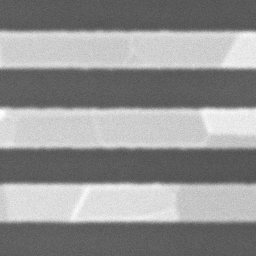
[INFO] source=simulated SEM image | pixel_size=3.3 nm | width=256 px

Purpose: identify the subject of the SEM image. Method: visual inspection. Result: lines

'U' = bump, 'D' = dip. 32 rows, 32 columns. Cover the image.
DDDDDDDDDDDDDDDDDDDDDDDDDDDDDDDD
DDDDDDDDDDDDDDDDDDDDDDDDDDDDDDDD
DDDDDDDDDDDDDDDDDDDDDDDDDDDDDDDD
DDDDDDDDDDDDDDDDDDDDDDDDDDDDDDDD
UUUUUUUUUUUUUUUUUUUUUUUUUUUUUUUU
UUUUUUUUUUUUUUUUUUUUUUUUUUUUUUUU
UUUUUUUUUUUUUUUUUUUUUUUUUUUUUUUU
UUUUUUUUUUUUUUUUUUUUUUUUUUUUUUUU
DDDDDDDDDDUDDDDDDDDDDDDDDDDDDDDD
DDDDDDDDDDDDDDDDDDDDDDDDDDDDDDDD
DDDDDDDDDDDDDDDDDDDDDDDDDDDDDDDD
DDDDDDDDDDDDDDDDDDDDDDDDDDDDDDDD
DDDDDDDDDDDDDDDDDDDDDDDDDDDDDDDD
DDDDDDDDDDDDDDDDDDDDDDDDDDDDDDDD
UUUUUUUUUUUUUUUUUUUUUUUUUUUUUUUU
UUUUUUUUUUUUUUUUUUUUUUUUUUUUUUUU
UUUUUUUUUUUUUUUUUUUUUUUUUUUUUUUU
UUUUUUUUUUUUUUUUUUUUUUUUUUUUUUUU
DDDDDDDDDDDDDDDDDDDDDDDDDDDDDDDD
DDDDDDDDDDDDDDDDDDDDDDDDDDDDDDDD
DDDDDDDDDDDDDDDDDDDDDDDDDDDDDDDD
DDDDDDDDDDDDDDDDDDDDDDDDDDDDDDDD
DDDDDDDDDDDDDDDDDDDDDDDDDDDDDDDD
UUUUUUUUUUUUUUUUUUUUUUUUUUUUUUUU
UUUUUUUUUUUUUUUUUUUUUUUUUUUUUUUU
UUUUUUUUUUUUUUUUUUUUUUUUUUUUUUUU
UUUUUUUUUUUUUUUUUUUUUUUUUUUUUUUU
UUUUUUUUUUUUUUUUUUUUUUUUUUUUUUUU
DDDDDDDDDDDDDDDDDDDDDDDDDDDDDDDD
DDDDDDDDDDDDDDDDDDDDDDDDDDDDDDDD
DDDDDDDDDDDDDDDDDDDDDDDDDDDDDDDD
DDDDDDDDDDDDDDDDDDDDDDDDDDDDDDDD